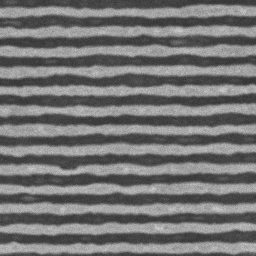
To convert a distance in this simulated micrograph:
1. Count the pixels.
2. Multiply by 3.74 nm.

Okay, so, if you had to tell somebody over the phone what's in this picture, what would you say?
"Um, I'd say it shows parallel lines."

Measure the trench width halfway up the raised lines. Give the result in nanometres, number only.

37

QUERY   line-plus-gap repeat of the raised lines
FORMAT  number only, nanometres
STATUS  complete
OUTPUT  73.6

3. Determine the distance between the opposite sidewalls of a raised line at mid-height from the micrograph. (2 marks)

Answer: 36.5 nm